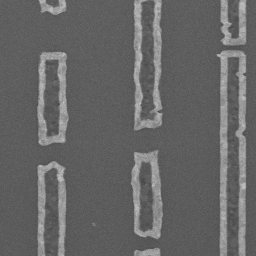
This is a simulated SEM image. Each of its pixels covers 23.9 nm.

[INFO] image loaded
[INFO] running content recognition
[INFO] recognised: one or a few lines or trenches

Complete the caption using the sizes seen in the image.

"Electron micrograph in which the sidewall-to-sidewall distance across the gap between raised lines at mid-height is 1690 nm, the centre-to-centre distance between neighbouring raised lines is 2.15 microns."